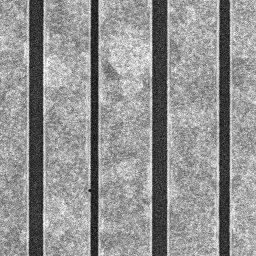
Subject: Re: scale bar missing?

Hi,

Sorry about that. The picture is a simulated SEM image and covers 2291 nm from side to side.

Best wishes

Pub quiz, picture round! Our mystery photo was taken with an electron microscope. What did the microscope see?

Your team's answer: one or a few lines or trenches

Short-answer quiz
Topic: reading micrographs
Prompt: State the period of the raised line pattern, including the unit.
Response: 0.564 um